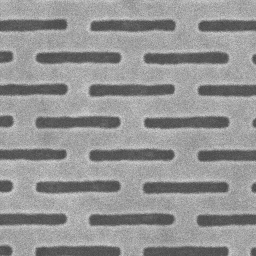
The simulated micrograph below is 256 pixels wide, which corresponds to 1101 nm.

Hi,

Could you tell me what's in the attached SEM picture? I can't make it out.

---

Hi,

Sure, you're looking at a regular array of holes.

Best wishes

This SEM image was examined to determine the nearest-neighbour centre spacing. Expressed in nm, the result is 269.